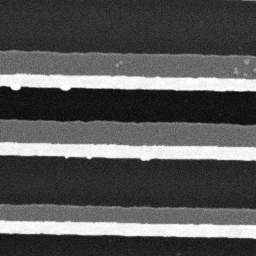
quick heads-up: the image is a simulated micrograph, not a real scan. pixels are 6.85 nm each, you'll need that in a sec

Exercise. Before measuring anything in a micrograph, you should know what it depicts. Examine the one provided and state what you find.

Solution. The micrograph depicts lines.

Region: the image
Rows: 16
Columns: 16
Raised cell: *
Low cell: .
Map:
................
................
................
***************.
****************
....*..*********
................
................
****************
****************
................
................
................
****************
****************
................